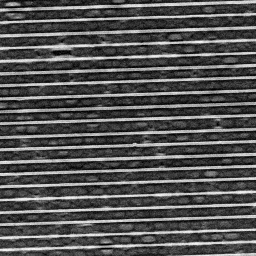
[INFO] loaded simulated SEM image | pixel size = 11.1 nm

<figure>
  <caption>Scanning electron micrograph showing parallel lines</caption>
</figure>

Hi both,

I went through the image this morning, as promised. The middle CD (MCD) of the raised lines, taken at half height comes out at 20.7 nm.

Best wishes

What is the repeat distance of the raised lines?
140 nm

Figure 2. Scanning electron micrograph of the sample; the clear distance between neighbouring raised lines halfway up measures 113 nm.